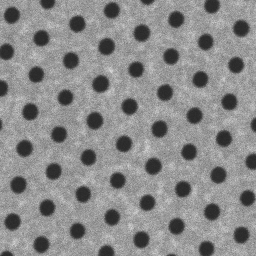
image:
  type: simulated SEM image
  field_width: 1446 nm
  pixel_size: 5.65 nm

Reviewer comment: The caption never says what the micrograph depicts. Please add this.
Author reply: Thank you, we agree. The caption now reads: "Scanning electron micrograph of a regular array of holes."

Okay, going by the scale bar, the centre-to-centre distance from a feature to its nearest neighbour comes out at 36.9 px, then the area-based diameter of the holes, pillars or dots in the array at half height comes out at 90.8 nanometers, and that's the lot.